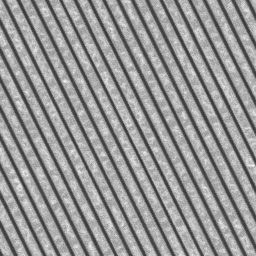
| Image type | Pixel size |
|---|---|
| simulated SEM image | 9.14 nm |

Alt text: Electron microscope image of parallel lines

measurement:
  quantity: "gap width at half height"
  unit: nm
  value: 31.7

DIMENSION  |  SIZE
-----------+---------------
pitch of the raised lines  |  117 nanometers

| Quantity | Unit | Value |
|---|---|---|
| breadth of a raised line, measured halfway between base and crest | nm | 87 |